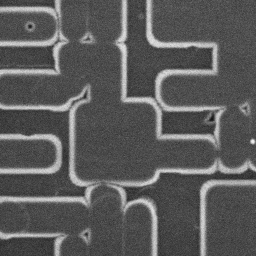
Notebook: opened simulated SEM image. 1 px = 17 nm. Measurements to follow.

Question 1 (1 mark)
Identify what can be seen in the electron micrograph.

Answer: wiring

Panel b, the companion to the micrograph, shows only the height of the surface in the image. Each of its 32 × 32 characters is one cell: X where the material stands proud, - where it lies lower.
-------XXXXXXXXX---XXXXXXXXXXXXX
XXXXXXXXXXXXXXXX---XXXXXXXXXXXXX
XXXXXXXXXXXXXXXX---XXXXXXXXXXXXX
XXXXXXXXXXXXXXXX---XXXXXXXXXXXXX
XXXXXXXXXXXXXXXX---XXXXXXXXXXXXX
XXXXXX-XXXXXXXX----XXXXXXXXXXXXX
-------XXXXXXXXX-----------XXXXX
-------XXXXXXXXX-----------XXXXX
-------XXXXXXXXX-----------XXXXX
XXXXXXXXXXXXXXXX----XXXXXXXXXXXX
XXXXXXXXXXXXXXXX----XXXXXXXXXXXX
XXXXXXXXXXXXXXXX----XXXXXXXXXXXX
XXXXXXXXXXXXXXXXXXX-XXXXXXXXXXXX
------XX-XXXXXXXXXXX-XXXXXXXXXXX
---------XXXXXXXXXXX-------XXXXX
---------XXXXXXXXXXX-------XXXXX
---------XXXXXXXXXXX-------XXXXX
XXXXXXX--XXXXXXXXXXXXXXXXXXXXXXX
XXXXXXX--XXXXXXXXXXXXXXXXXXXXXXX
XXXXXXX--XXXXXXXXXXXXXXXXXXXXXXX
XXXXXXX--XXXXXXXXXXXXXXXXXXXXXXX
---------XXXXXXXXXXX---XXX------
---------XXXXXXXXXX-------------
-----------XXXX-----------XXXXXX
-----------XXXXX---------XXXXXXX
XXXXXXXXXXXXXXXXXXX------XXXXXXX
XXXXXXXXXXXXXXXXXXX------XXXXXXX
XXXXXXXXXXXXXXXXXXX------XXXXXXX
XXXXXXXXXXXXXXXXXXX------XXXXXXX
X------XXXXXXXXXXXX------XXXXXXX
-------XXXXXXXXXXXX------XXXXXXX
-------XXXXXXXXXXXX------XXXXXXX